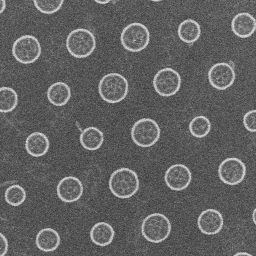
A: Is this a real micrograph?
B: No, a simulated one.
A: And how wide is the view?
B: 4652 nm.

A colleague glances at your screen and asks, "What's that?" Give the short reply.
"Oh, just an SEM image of a regular array of raised bodies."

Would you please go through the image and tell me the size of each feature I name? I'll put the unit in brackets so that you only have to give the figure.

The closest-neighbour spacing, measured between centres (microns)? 0.988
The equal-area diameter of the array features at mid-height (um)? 0.438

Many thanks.